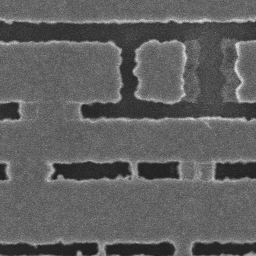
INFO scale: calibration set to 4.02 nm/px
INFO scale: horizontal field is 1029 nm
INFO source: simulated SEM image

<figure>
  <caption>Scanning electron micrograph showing one or a few lines or trenches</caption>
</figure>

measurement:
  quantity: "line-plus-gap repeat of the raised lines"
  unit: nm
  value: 279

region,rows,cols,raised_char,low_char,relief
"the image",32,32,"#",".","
################################
################################
#####################.##########
................................
................................
##############....#####.......##
###############..######.......##
###############..######.......##
###############..######.......##
###############..######.......##
###############..######.......##
###############..######.......##
###############...####........##
..########......................
...#######......................
################################
################################
################################
################################
################################
.######.........#.....#####.....
.######.........#.....#####.....
.########..################.####
################################
################################
################################
################################
################################
################################
################################
....###.#...##.......###........
............#.........##........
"